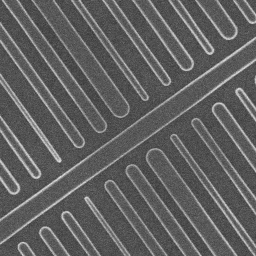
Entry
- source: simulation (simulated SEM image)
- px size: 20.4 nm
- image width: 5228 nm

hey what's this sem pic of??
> groups of lines, slits or small figures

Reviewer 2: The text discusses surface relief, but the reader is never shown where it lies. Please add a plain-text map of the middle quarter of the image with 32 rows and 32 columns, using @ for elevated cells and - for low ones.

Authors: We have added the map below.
----@@@@@-----@@-----@@@-----@@@
@----@@@@@-----@------@@@-------
@@---@@@@@@----@@------@@@------
@@----@@@@@-----@@------@@------
@@@----@@@@@----@@------@@@-----
@@@@---@@@@@@----@@------------@
-@@@@---@@@@@@----@@---------@@@
-@@@@----@@@@@-----@@-------@@@@
--@@@@---@@@@@@----@@------@@@@@
---@@@@---@@@@@@---------@@@@@@@
---@@@@----@@@@@--------@@@@@@@@
----@@@@---@@@@@------@@@@@@@@@-
-----@@@@---@@@@-----@@@@@@@@---
@-----@@@@----------@@@@@@@@----
@@----@@@@--------@@@@@@@@@-----
@@@----@@@@------@@@@@@@@-------
@@@-----@@-----@@@@@@@@@--------
-@@@----------@@@@@@@@@---------
-@@@@-------@@@@@@@@@------@@---
--@@@------@@@@@@@@@-------@@---
---@@-----@@@@@@@@----------@@--
--------@@@@@@@@@-----@@-----@@-
-------@@@@@@@@------@@@@----@@-
------@@@@@@@@-------@@@@@----@@
----@@@@@@@@@--------@@@@@-----@
---@@@@@@@@-----@@---@@@@@@-----
--@@@@@@@@------@@@---@@@@@@----
@@@@@@@@--------@@@@---@@@@@@---
@@@@@@@---------@@@@----@@@@@---
@@@@@------@-----@@@@---@@@@@@--
@@@@------@@@-----@@@@---@@@@@@-
@@---------@@@-----@@@@---@@@@@@